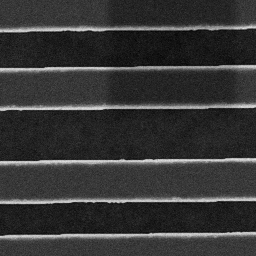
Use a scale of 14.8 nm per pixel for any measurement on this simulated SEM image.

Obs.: lines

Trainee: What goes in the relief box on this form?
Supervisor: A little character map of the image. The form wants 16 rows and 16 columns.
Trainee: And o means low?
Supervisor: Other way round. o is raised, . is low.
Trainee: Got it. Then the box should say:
oooooooooooooooo
oooooooooooooooo
................
................
oooooooooooooooo
oooooooooooooooo
oooooooooooooooo
................
................
................
oooooooooooooooo
oooooooooooooooo
oooooooooooooooo
................
................
oooooooooooooooo